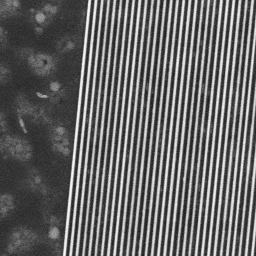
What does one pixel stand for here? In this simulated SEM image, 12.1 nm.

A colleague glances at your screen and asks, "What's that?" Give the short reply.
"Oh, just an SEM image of parallel lines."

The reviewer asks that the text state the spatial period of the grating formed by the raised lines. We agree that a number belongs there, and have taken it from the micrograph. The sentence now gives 75.3 nanometers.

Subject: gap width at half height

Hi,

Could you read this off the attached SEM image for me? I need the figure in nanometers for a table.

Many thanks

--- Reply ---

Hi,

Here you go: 52.6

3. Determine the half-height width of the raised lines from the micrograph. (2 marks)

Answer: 1.74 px